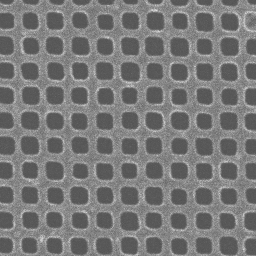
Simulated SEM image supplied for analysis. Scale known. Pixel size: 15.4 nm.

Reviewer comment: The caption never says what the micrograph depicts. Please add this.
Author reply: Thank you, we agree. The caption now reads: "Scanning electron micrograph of a regular array of holes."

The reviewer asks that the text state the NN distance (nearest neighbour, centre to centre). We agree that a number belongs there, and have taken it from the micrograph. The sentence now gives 372 nanometers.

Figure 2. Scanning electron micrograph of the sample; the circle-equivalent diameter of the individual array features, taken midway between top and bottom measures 276 nanometres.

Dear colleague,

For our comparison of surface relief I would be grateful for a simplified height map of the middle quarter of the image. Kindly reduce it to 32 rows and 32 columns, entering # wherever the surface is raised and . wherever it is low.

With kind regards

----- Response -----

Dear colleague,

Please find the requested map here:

##....##....##.....##....##....#
##....##....##.....##....##....#
##....##.....#.....##....##....#
###...###...##.....##....##....#
################################
################################
##....###...###...###....##...##
##....##....##....###....##....#
##....##.....#....###....##....#
##....###...###...###...###....#
################################
################################
##...###....###...###...###....#
##....##....##.....#.....##....#
##....##.....#.....#.....##....#
##....##.....##....##....##....#
#########...##########..####..##
################################
##...####..####..####...####..##
##....##....##....##.....##....#
##....##....##....##.....##....#
##....##....##....###...###....#
###.######.#####..####..###...##
################################
#####################..#####.###
##....##....###...###....##....#
##....##....##....##.....##....#
##....##....##....###....##....#
###...###...###...###...###...##
################################
###.############################
##....##....##....##.....##..###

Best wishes